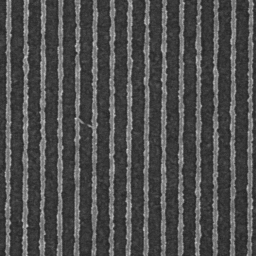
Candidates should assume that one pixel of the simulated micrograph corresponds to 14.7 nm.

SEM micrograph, parallel lines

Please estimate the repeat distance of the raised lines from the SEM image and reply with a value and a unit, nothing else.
0.254 micrometres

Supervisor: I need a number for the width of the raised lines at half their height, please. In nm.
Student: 47.8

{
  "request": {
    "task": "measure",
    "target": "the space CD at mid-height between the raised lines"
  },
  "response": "204 nm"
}